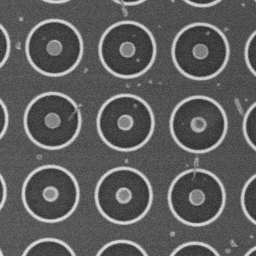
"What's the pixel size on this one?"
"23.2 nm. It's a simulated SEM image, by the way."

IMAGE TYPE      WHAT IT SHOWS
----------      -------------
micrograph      an array of small figures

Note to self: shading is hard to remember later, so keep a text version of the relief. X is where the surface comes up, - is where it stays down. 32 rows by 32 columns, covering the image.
XXXXXXXXXXXXXXXXXXXXXXXX--XXXXXX
XXXXXXXXXXXXXXXXXXXXXXXXXXXXXXXX
XXXXXXXXXXXXXXXXXXXXXXXXXXXXXXXX
XXXX-----XXXXX----XXXXX----XXXXX
-XXX------XXX------XXX------XXXX
-XX-------XXX------XXX------XXX-
-XX-------XXX--XX--XXX--XX--XXX-
-XXX------XXX------XXX------XXX-
XXXXX----XXXX-----XXXX------XXX-
XXXXXXXXXXXXXXX--XXXXXXX--XXXXXX
XXXXXXXXXXXXXXXXXXXXXXXXXXXXXXXX
XXXXXXXXXXXXXXXXXXXXXXXXXXXXXXXX
XXXX-----XXXXX----XXXXX---XXXXXX
-XXX-----XXXX------XXX-----XXXX-
-XX---X---XX-------XXX------XXX-
-XX---X---XX---X---XX---X---XXX-
XXX-------XXX------XXX------XXX-
XXXX-----XXXX-----XXXX------XXX-
XXXXXXXXXXXXXXX--XXXXXX---XXXXXX
XXXXXXXXXXXXXXXXXXXXXXXXXXXXXXXX
XXXXXXXXXXXXXXXXXXXXXXXXXXXXXXXX
XXXX----XXXXXX---XXXXXX---XXXXXX
XXX------XXXX-----XXXX-----XXXX-
-XX-------XX-------XX-------XXX-
XXX---X---XX---X---XX-------XX--
XXX------XXX-------XX-------XX--
XXXX-----XXXX-----XXXX-----XXXX-
XXXXX--XXXXXXX---XXXXXX---XXXXXX
XXXXXXXXXXXXXXXXXXXXXXXXXXXXXXXX
XXXXXXXXXXXXXXXXXXXXXXXXXXXXXXXX
XXXX----XXXXXX---XXXXXXX-XXXXXXX
XXX------XXXX-----XXXX-----XXXX-